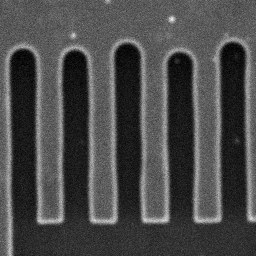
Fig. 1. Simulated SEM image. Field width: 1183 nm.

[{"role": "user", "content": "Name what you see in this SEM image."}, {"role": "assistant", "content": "groups of lines, slits or small figures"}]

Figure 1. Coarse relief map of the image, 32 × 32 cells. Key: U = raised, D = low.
UUUUUUUUUUUUUUUUUUUUUUUUUUUUUUUU
UUUUUUUUUUUUUUUUUUUUUUUUUUUUUUUU
UUUUUUUUUUUUUUUUUUUUUUUUUUUUUUUU
UUUUUUUUUUUUUUUUUUUUUUUUUUUUUUUU
UUUUUUUUUUUUUUUUUUUUUUUUUUUUUUUU
UUUUUUUUUUUUUUUDDUUUUUUUUUUUDDUU
UUDDUUUUDDUUUUDDDDUUUUDUUUUDDDDU
UDDDDUUUDDDUUUDDDDUUUDDDUUUDDDDU
UDDDDUUUDDDUUUDDDDUUUDDDUUUDDDDU
UDDDDUUUDDDUUUDDDDUUUDDDUUUDDDDU
UDDDDUUUDDDUUUDDDDUUUDDDUUUDDDDU
UDDDDUUUDDDUUUDDDDUUUDDDUUUDDDDU
UDDDDUUUDDDUUUDDDDUUUDDDUUUDDDDU
UDDDDUUUDDDUUUDDDDUUUDDDUUUDDDDU
UDDDDUUUDDDUUUDDDDUUUDDDUUUDDDDU
UDDDDUUUDDDUUUDDDDUUUDDDUUUUDDDU
UDDDDUUUDDDUUUDDDDUUUDDDUUUDDDDU
UDDDDUUUDDDUUUDDDDUUUDDDUUUDDDDU
UDDDDUUUDDDUUUDDDDUUUDDDUUUDDDDU
UDDDDUUUDDDUUUDDDDUUUDDDUUUDDDDU
UDDDDUUUDDDUUUDDDDUUUDDDUUUDDDDU
UDDDDUUUDDDUUUDDDDUUUDDDUUUDDDDU
UDDDDUUUDDDUUUDDDDUUUDDDUUUDDDDU
UDDDDUUUDDDUUUDDDDUUUDDDUUUDDDDU
UDDDDUUUDDDUUUDDDDUUUDDDUUUUDDDU
UDDDDUUUDDDUUUDDDDUUUDDDUUUUDDDU
UDDDDUUUDDDUUUDDDDUUUDDDUUUUDDDU
UDDDDUUUDDDDUUDDDDUUUDDDDUUDDDDU
UDDDDDDDDDDDDDDDDDDDDDDDDDDDDDDD
UDDDDDDDDDDDDDDDDDDDDDDDDDDDDDDD
UDDDDDDDDDDDDDDDDDDDDDDDDDDDDDDD
UDDDDDDDDDDDDDDDDDDDDDDDDDDDDDDD